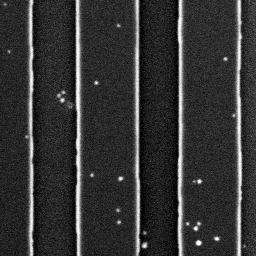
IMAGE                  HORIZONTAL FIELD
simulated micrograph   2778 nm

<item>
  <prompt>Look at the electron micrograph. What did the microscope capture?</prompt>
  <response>lines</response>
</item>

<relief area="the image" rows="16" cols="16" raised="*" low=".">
**...****..****.
**...****..****.
**...****..****.
**...****..****.
**...****..****.
**...****..****.
**...****..****.
**...****..****.
**...****..****.
**...****..****.
**...****..****.
**...****..****.
**...****..****.
**...****..****.
**...****..****.
**...****..****.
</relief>